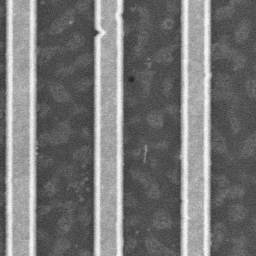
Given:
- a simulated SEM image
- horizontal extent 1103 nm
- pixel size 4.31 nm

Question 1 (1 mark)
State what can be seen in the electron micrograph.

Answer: one or a few lines or trenches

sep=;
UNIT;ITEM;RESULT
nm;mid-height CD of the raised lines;89.4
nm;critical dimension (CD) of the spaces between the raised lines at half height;287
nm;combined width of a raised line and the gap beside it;377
